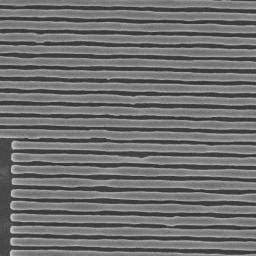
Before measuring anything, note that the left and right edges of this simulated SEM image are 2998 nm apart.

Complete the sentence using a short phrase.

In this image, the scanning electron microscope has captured parallel lines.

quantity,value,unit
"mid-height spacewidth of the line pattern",45.4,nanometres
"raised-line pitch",141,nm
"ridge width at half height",90.8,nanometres